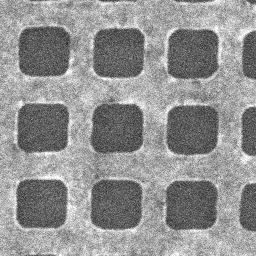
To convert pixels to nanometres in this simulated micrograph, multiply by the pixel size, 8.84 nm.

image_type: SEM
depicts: a regular array of holes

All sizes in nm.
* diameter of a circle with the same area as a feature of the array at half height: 496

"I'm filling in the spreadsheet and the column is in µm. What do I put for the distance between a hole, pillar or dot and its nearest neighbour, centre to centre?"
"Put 0.658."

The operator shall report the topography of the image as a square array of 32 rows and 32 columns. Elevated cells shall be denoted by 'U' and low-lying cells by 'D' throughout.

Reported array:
UUUUUUUUUUUUUUUUUUUUUUUUUUUUUUUD
UUUUUUUUUUUUUUUUUUUUUUUUUUUUUUUU
UUUUUUUUUUUUUUUUUUUUUUUUUUUUUUUU
UUUDDDDDUUUUUDDUDUUUUUUUUUUUUUUU
UUDDDDDDDUUUDDDDDDUUUDDDDDDUUUUD
UUDDDDDDDUUUDDDDDDUUUDDDDDDUUUDD
UUDDDDDDDUUUDDDDDDUUUDDDDDDUUUDD
UUDDDDDDDUUUDDDDDDUUUDDDDDDUUUDD
UUDDDDDDDUUUDDDDDDUUUDDDDDDUUUDD
UUUUDDDDUUUUDDDDDUUUUDDDDDDUUUUD
UUUUUUUUUUUUUUUUUUUUUUUUUUUUUUUU
UUUUUUUUUUUUUUUUUUUUUUUUUUUUUUUU
UUUUUUUUUUUUUUUUUUUUUUUUUUUUUUUU
UUUDDDDDUUUUDDDDDDUUUDDDDDDUUUUD
UUDDDDDDDUUDDDDDDDUUUDDDDDDUUUDD
UUDDDDDDDUUDDDDDDDUUUDDDDDDUUUDD
UUDDDDDDDUUDDDDDDDUUUDDDDDDUUUDD
UUDDDDDDDUUDDDDDDDUUUDDDDDDUUUDD
UUDDDDDDUUUDDDDDDDUUUDDDDDDUUUDD
UUUUUUUUUUUUUUUUUUUUUUUUUUUUUUUD
UUUUUUUUUUUUUUUUUUUUUUUUUUUUUUUU
UUUUUUUUUUUUUUUUUUUUUUUUUUUUUUUU
UUUDDDDUUUUUDDDDUUUUUUUDDDUUUUUU
UUDDDDDDDUUDDDDDDDUUUDDDDDDUUUDD
UUDDDDDDDUUDDDDDDDUUUDDDDDDUUUDD
UUDDDDDDDUUDDDDDDDUUUDDDDDDUUUDD
UUDDDDDDUUUDDDDDDDUUUDDDDDDUUUDD
UUDDDDDDUUUDDDDDDDUUUDDDDDDUUUDD
UUUDDDDUUUUUDDDDDUUUUDDDDDUUUUDD
UUUUUUUUUUUUUUUUUUUUUUUUUUUUUUUU
UUUUUUUUUUUUUUUUUUUUUUUUUUUUUUUU
UUUUUUUUUUUUUUUUUUUUUUUUUUUUUUUU